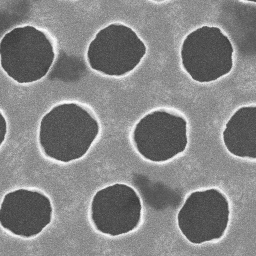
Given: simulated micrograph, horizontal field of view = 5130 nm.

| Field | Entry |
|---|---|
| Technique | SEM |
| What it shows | holes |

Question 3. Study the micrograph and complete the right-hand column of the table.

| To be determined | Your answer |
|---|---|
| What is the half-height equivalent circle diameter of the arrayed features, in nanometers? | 1070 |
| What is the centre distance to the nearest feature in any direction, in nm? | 1800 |